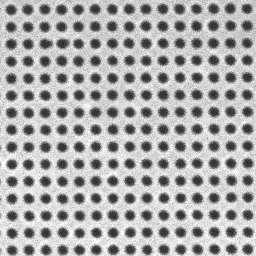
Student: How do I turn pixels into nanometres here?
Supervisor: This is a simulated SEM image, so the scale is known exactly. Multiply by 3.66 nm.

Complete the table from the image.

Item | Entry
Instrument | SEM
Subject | a regular array of holes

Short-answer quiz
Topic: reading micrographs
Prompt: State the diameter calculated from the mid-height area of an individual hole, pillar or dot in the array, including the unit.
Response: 0.0415 microns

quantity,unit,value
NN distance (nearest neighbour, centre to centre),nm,60.4